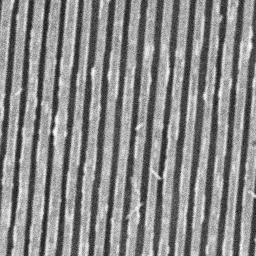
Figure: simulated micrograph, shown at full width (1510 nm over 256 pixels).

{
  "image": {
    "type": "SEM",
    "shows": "parallel lines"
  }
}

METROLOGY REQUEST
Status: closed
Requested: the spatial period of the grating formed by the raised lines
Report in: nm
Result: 94.8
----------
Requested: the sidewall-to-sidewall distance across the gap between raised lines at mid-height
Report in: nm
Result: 38.2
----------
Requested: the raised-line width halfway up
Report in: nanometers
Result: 54.3